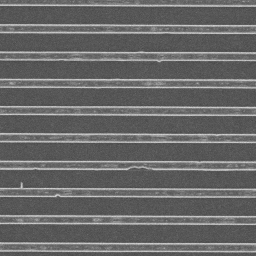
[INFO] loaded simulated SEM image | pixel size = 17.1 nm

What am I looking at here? parallel lines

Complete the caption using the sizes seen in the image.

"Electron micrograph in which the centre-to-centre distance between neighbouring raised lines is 466 nanometres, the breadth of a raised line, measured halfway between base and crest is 8 px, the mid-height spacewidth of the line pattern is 335 nm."